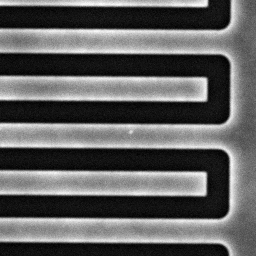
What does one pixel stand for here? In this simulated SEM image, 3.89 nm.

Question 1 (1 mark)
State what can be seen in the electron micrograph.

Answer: groups of lines, slits or small figures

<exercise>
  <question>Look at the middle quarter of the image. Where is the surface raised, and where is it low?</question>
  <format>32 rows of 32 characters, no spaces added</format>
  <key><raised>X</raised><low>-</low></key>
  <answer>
--------------------------------
--------------------------------
--------------------------------
XXXXXXXXXXXXXXXXXXXXXX----------
XXXXXXXXXXXXXXXXXXXXXXXXXXXXXXXX
XXXXXXXXXXXXXXXXXXXXXXXXXXXXXXXX
XXXXXXXXXXXXXXXXXXXXXXXXXXXXXXXX
XXXXXXXXXXXXXXXXXXXXXXXXXXXXXXXX
XXXXXXXXXXXXXXXXXXXXXXXXXXXXXXXX
--------------------------------
--------------------------------
--------------------------------
--------------------------------
--------------------------------
--------------------------------
XXXXXXXXXXXXXXXXXXXXXXXXXXXXXXXX
XXXXXXXXXXXXXXXXXXXXXXXXXXXXXXXX
XXXXXXXXXXXXXXXXXXXXXXXXXXXXXXXX
XXXXXXXXXXXXXXXXXXXXXXXXXXXXXXXX
XXXXXXXXXXXXXXXXXXXXXXXXXXXXXXXX
XXXXXXXXXXXXXXXXXXXXXXXXXXXXXXXX
--------------------------------
--------------------------------
--------------------------------
--------------------------------
--------------------------------
--------------------------------
XXXXXXXXXXXXXXXXXXXXXXXXXXXXXXXX
XXXXXXXXXXXXXXXXXXXXXXXXXXXXXXXX
XXXXXXXXXXXXXXXXXXXXXXXXXXXXXXXX
XXXXXXXXXXXXXXXXXXXXXXXXXXXXXXXX
XXXXXXXXXXXXXXXXXXXXXXXXXXXXXXXX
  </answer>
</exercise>